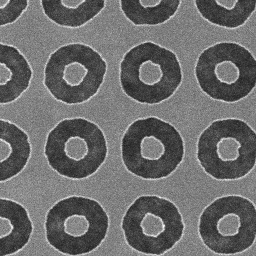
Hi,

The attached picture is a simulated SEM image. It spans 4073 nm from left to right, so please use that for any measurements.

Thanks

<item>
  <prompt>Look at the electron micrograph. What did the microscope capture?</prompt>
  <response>ring-shaped grooves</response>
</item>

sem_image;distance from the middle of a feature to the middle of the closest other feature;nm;1200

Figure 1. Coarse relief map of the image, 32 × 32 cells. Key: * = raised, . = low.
*..**...**...**...**..**...**...
...***......***.......***.......
..****.....*****.....*****.....*
********************************
********************************
*********.********.********...**
..*****.....****.....****......*
...***.......**.......***.......
*...**..***..**...**...*...***..
*...**..***..**...**...**..***..
....**...*...**...*...***.......
...***......****......****.....*
..*****....******...*******...**
********************************
********************************
..*****.....****.....*****.....*
...***.......***......***.......
....**...*...**...**...**...*...
*...**..***..**...**...**..***..
*...**...*...**...**...**..***..
...***.......***......***.......
..*****.....****......****.....*
.*******************************
********************************
******************.**********.**
..*****.....*****.....****......
...***.......***......***.......
*...**..***...*...**...**...**..
*...**..***..**...**...**..***..
*...**.......***.......**.......
...***......****......****......
..******...*******...******...**